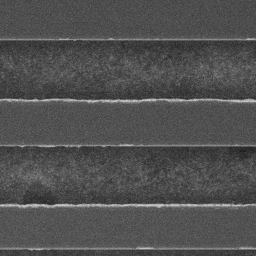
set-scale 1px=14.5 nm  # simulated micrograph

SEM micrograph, lines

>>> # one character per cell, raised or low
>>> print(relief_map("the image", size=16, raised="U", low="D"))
UUUUUUUUUUUUUUUU
UUUUUUUUUUUUUUUU
DDDDDDDDDDDDDDDD
DDDDDDDDDDDDDDDD
DDDDDDDDDDDDDDDD
DDDDDDDDDDDDDDDD
UUUUUUUUUUUUUUUU
UUUUUUUUUUUUUUUU
UUUUUUUUUUUUUUUU
DDDDDDDDDDDDDDDD
DDDDDDDDDDDDDDDD
DDDDDDDDDDDDDDDD
DDDDDDDDDDDDDDDD
UUUUUUUUUUUUUUUU
UUUUUUUUUUUUUUUU
UUUUUUUUUUUUUUUU